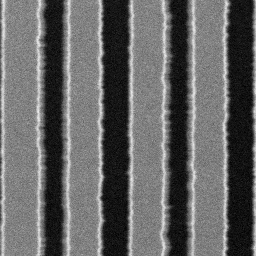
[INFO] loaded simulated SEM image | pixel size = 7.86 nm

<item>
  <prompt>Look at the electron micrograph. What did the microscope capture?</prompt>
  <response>lines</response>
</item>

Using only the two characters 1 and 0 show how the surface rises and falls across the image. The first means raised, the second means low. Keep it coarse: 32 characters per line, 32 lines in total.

11111000011110001111100011110000
11111000111110001111100011110000
11111000111110001111100011110000
11111000111110001111100011110000
11111000111110000111100011110000
11111000111110001111100011110000
11111000111110001111100011110000
11111000111110001111100011110000
11111000111110001111100011110000
11111000111110001111000011110000
11111000111110001111100011110000
11111000111110001111100011110000
11111000111110001111100011110000
11111000111110001111100011110000
11111000111110001111100011110000
11111000111110001111100011110000
11111000111110001111100011110000
11111000111110001111100011110000
11111000111110001111000011110000
11111000111110001111100011110000
11111000011110001111000011110000
11111000111110001111100011110000
11111000111110001111100011110000
11111000111110001111100011110000
11111000111100001111000011110000
11111000111110001111000011110000
11111000111110001111100011110000
11111000111110001111100011110000
11111000111110001111000011110000
11111000111110001111000011110000
11111000111110001111100011110000
11111000111110001111000011110000